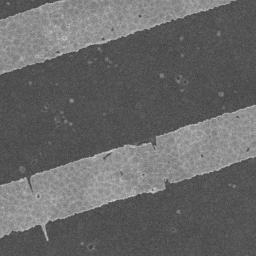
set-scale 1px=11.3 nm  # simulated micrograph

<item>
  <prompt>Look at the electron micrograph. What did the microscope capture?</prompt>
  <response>one or a few lines or trenches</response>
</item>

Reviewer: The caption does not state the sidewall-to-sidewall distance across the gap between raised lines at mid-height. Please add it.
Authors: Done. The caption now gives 1190 nanometres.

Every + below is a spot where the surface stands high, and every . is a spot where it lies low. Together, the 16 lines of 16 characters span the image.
..+++++++++++...
++++++++++......
++++++..........
+++.............
................
................
................
.............+++
..........++++++
.......+++++++++
....++++++++++..
.+++++++++......
+++++++.........
++++............
+...............
................